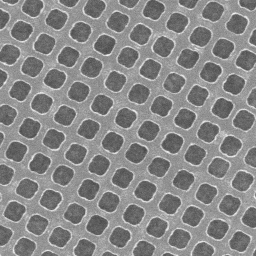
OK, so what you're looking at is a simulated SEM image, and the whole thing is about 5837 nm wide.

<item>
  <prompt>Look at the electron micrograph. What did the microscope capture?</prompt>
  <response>a regular array of holes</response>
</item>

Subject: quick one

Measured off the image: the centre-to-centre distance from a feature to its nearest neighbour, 590 nm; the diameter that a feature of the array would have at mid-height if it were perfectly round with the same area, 469 nanometres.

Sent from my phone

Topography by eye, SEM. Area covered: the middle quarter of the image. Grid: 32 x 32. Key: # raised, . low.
..##......#####..##.....#####...
####.....##########.....########
#####....##....####.....##..####
.##########.....####...##.....##
###.######.....##########.....##
##....####.....##...#####.....##
#.....#####...##.....####....###
#.....##########......#########.
#.....##....####.....##...#####.
###.###.....#####...##.....####.
.######.....##########.....#####
...####....###...#####.....##..#
...######..##.....#####...##....
...##########.....##########....
..###...#####.....##..######....
.###.....#####...##.....####....
###......#########......########
###.....###...####.....###..####
#####...##.....####....##.....##
#########......#########......##
##...#####....###...####......#.
#.....#####...##.....####....##.
......#########......######.##..
.....##....####.....###..#####..
##..###....######..###....#####.
.#####.....##########.....######
..####.....##...#####.....###.##
...#####..##.....#####...###....
..##########.....###########....
.####...####.....##...#####.....
####.....####...##.....#####....
###......#########.....#######.#